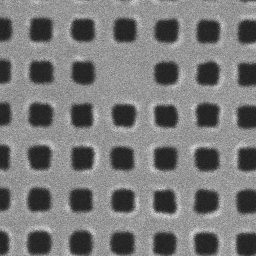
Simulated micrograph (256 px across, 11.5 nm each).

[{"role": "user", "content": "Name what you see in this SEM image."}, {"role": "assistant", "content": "a regular array of holes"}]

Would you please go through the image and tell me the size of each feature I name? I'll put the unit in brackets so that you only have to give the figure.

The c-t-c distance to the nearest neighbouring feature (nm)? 478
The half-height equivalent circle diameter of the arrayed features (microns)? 0.305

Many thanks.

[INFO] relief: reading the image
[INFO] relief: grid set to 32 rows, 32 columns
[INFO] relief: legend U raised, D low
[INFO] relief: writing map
UUUUUUUUUUUUUUUUUUUUUUUUUUUUUUUU
UUUUUUUUUUUUUUUUUUUUUUUUUUUUUUUU
DUUUDDUUUDDDUUDDDUUUDDUUUDDUUUUD
DDUUDDDUUDDDUUDDDUUDDDUUDDDDUUDD
DUUUDDDUUDDDUUDDDUUDDDUUDDDDUUDD
UUUUUUUUUUUUUUUUUUUUUUUUUUDUUUUU
UUUUUUUUUUUUUUUUUUUUUUUUUUUUUUUU
DUUUUUUUUUUUUUUUUUUUUUUUUUUUUUUU
DUUUDDDUUDDDUUUUUUUDDDUUUDDUUUDD
DUUUDDDUUDDDUUUUUUUDDDUUDDDUUUDD
UUUUDDUUUUDUUUUUUUUUDDUUUDDUUUDD
UUUUUUUUUUUUUUUUUUUUUUUUUUUUUUUU
UUUUUUUUUUUUUUUUUUUUUUUUUUUUUUUU
DUUUDDDUUDDDUUDDDUUDDDUUDDDUUUDD
DUUUDDDUUDDDUUDDDUUDDDUUDDDUUUDD
DUUUDDUUUDDDUUDDDUUDDDUUUDDUUUDD
UUUUUUUUUUUUUUUUUUUUUUUUUUUUUUUU
UUUUUUUUUUUUUUUUUUUUUUUUUUUUUUUU
DUUUDDUUUDDUUUDDUUUDDDUUUDDUUUDD
DUUDDDUUUDDDUUDDDUUDDDUUDDDUUUDD
DUUUDDUUUDDDUUDDDUUDDDUUDDDUUUDD
UUUUUUUUUUUUUUUUUUUUUUUUUUUUUUUU
UUUUUUUUUUUUUUUUUUUUUUUUUUUUUUUU
DUUUDUUUUUUUUUUDUUUUUUUUUUUUUUUU
DUUDDDUUUDDDUUDDDUUDDDUUDDDUUUDD
DUUDDDUUUDDDUUDDDUUDDDUUDDDUUUDD
UUUUDUUUUDDUUUDDUUUUDDUUDDDUUUDD
UUUUUUUUUUUUUUUUUUUUUUUUUUUUUUUU
UUUUUUUUUUUUUUUUUUUUUUUUUUUUUUUU
DUUDDDUUUDDDUUDDDUUDDDUUDDDUUUDD
DUUDDDUUUDDDUUDDDUUDDDUUDDDUUDDD
DUUUDDUUUDDUUUDDDUUDDDUUDDDUUDDD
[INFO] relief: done